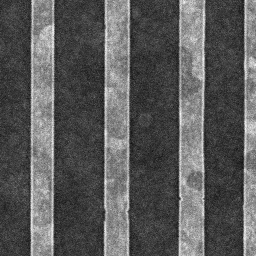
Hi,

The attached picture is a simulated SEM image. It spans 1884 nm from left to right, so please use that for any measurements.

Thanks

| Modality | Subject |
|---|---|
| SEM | one or a few lines or trenches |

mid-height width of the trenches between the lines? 0.377 micrometres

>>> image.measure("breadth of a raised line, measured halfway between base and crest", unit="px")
23.2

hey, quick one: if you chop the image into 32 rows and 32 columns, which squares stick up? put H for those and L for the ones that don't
LLLLHHHLLLLLLHHHLLLLLLLHHHLLLLLH
LLLLHHHLLLLLLHHHLLLLLLLHHHLLLLLH
LLLLHHHLLLLLLHHHLLLLLLLHHHLLLLLH
LLLLHHHLLLLLLHHHLLLLLLLHHHLLLLLH
LLLLHHHLLLLLLHHHLLLLLLLHHLLLLLLH
LLLLHHHLLLLLLHHHLLLLLLLHHLLLLLLH
LLLLHHHLLLLLLHHHLLLLLLLHHLLLLLLH
LLLLHHHLLLLLLHHHLLLLLLLHHLLLLLLH
LLLLHHHLLLLLLHHHLLLLLLLHHLLLLLLH
LLLLHHHLLLLLLHHHLLLLLLLHHLLLLLLH
LLLLHHHLLLLLLHHHLLLLLLLHHLLLLLLH
LLLLHHHLLLLLLHHHLLLLLLLHHLLLLLLH
LLLLHHHLLLLLLHHHLLLLLLHHHLLLLLLH
LLLLHHHLLLLLLHHHLLLLLLHHHLLLLLLH
LLLLHHHLLLLLLHHHLLLLLLLHHLLLLLLH
LLLLHHHLLLLLLHHHLLLLLLLHHLLLLLLH
LLLLHHHLLLLLLHHHLLLLLLLHHLLLLLLH
LLLLHHHLLLLLLHHHLLLLLLLHHLLLLLLH
LLLLHHHLLLLLLHHHLLLLLLLHHLLLLLLH
LLLLHHHLLLLLLHHHLLLLLLLHHLLLLLLH
LLLLHHHLLLLLLHHHLLLLLLLHHLLLLLLH
LLLLHHHLLLLLLHHHLLLLLLLHHLLLLLLH
LLLLHHHLLLLLLHHHLLLLLLLHHLLLLLLH
LLLLHHHLLLLLLHHHLLLLLLLHHLLLLLLH
LLLLHHHLLLLLLHHHLLLLLLLHHLLLLLLH
LLLLHHHLLLLLLHHHLLLLLLLHHLLLLLLH
LLLLHHHLLLLLLHHHLLLLLLLHHLLLLLLH
LLLLHHHLLLLLLHHHLLLLLLHHHLLLLLLH
LLLLHHHLLLLLLHHHLLLLLLHHHLLLLLLH
LLLLHHHLLLLLLHHHLLLLLLHHHLLLLLLH
LLLLHHHLLLLLLHHHLLLLLLHHHLLLLLLH
LLLLHHHLLLLLLHHHLLLLLLHHHLLLLLLH